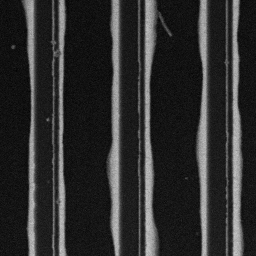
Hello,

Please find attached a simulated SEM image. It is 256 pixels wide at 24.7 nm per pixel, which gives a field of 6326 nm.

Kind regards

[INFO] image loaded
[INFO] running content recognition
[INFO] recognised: lines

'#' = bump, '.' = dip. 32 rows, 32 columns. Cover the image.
....####.......###........###...
....####.......###........###...
....####.......###........###...
....####.......###........###...
....####.......###........###...
....####.......###........###...
....####.......###........###...
....####.......###........###...
....####.......###........###...
....####.......###........###...
....####.......###........###...
....####.......###........###...
....####.......###........###...
....####.......###........###...
....####.......###........###...
....####.......###........###...
....####.......###........###...
....####.......###........###...
....####.......###........###...
....####.......###........###...
....####.......###........###...
....####.......###........###...
....####.......###........###...
....####.......###........###...
....####.......###........###...
....####.......###........###...
....####.......###........###...
....####.......###........###...
....####.......###........###...
....####.......###........###...
....####.......###........###...
....####.......###........###...